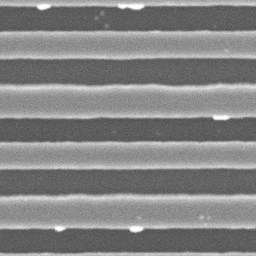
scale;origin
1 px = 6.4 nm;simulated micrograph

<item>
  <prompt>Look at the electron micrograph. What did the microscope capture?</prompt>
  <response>lines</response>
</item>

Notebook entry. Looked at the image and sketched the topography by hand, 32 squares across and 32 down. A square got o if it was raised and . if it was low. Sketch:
oooooooooooooooooooooooooooooooo
................................
................................
................................
oooooooooooooooooooooooooooooooo
oooooooooooooooooooooooooooooooo
oooooooooooooooooooooooooooooooo
................................
................................
................................
................................
oooooooooooooooooooooooooooooooo
oooooooooooooooooooooooooooooooo
oooooooooooooooooooooooooooooooo
oooooooooooooooooooooooooooooooo
................................
................................
................................
oooooooooooooooooooooooooooooooo
oooooooooooooooooooooooooooooooo
oooooooooooooooooooooooooooooooo
................................
................................
................................
................................
oooooooooooooooooooooooooooooooo
oooooooooooooooooooooooooooooooo
oooooooooooooooooooooooooooooooo
oooo.oooo....ooooo.oo........ooo
................................
................................
................................